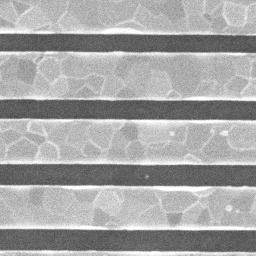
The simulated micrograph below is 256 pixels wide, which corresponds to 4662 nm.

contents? wiring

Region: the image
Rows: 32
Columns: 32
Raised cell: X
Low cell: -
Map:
XXXXXXXXXXXXXXXXXXXXXXXXXXXXXXXX
XXXXXXXXXXXXXXXXXXXXXXXXXXXXXXXX
XXXXXXXXXXXXXXXXXXXXXXXXXXXXXXXX
XXXXXXXXXXXXXXXXXXXXXXXXXXXXXXXX
--------------------------------
--------------------------------
--------------------------------
XXXXXXXXXXXXXXXXXXXXXXXXXXXXXXXX
XXXXXXXXXXXXXXXXXXXXXXXXXXXXXXXX
XXXXXXXXXXXXXXXXXXXXXXXXXXXXXXXX
XXXXXXXXXXXXXXXXXXXXXXXXXXXXXXXX
XXXXXXXXXXXXXXXXXXXXXXXXXXXXXXXX
--------------------------------
--------------------------------
--------------------------------
XXXXXXXXXXXXXXXXXXXXXXXXXXXXXXXX
XXXXXXXXXXXXXXXXXXXXXXXXXXXXXXXX
XXXXXXXXXXXXXXXXXXXXXXXXXXXXXXXX
XXXXXXXXXXXXXXXXXXXXXXXXXXXXXXXX
XXXXXXXXXXXXXXXXXXXXXXXXXXXXXXXX
--------------------------------
--------------------------------
--------------------------------
XXXXXXXXX--XXXXXXXXX------XXX---
XXXXXXXXXXXXXXXXXXXXXXXXXXXXXXXX
XXXXXXXXXXXXXXXXXXXXXXXXXXXXXXXX
XXXXXXXXXXXXXXXXXXXXXXXXXXXXXXXX
XXXXXXXXXXXXXXXXXXXXXXXXXXXXXXXX
X-----------XXXXX---XXX--X--XXXX
--------------------------------
--------------------------------
XXXXX-XXXXXXXX------------------